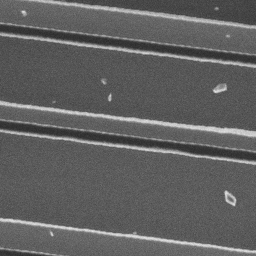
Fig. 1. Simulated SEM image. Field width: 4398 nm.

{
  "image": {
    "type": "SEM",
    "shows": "lines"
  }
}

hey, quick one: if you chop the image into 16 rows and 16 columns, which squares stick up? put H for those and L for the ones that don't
HHHHHHHLLLLLLLLL
HHHHHHHHHHHHHHLL
LLLHHHHHHHHHHHHH
LLLLLLLLLLLHHHHH
LLLLLLLLLLLLLLLL
LLLLLLLLLLLLLLLL
HLLLLLLLLLLLLLLL
HHHHHHHHHLLLLLLL
LLHHHHHHHHHHHHHH
LLLLLLLLLLHHHHHH
LLLLLLLLLLLLLLLL
LLLLLLLLLLLLLLLL
LLLLLLLLLLLLLLLL
LLLLLLLLLLLLLLLL
HHHHHHLLLLLLLLLL
HHHHHHHHHHHHHHLL